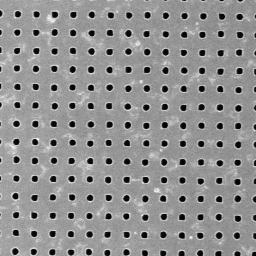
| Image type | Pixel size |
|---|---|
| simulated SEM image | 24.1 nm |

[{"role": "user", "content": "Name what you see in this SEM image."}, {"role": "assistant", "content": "a regular array of holes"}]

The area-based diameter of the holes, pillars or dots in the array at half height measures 0.168 um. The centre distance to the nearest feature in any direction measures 0.43 µm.